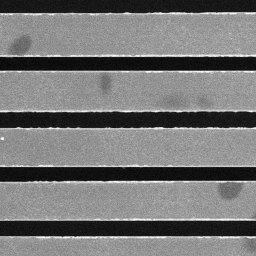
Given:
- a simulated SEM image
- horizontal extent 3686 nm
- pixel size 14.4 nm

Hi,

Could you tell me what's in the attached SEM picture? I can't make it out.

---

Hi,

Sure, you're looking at lines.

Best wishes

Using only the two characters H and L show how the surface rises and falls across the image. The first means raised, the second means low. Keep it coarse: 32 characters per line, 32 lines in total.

LLLLLLLLLLLLLLLLLLLLLLLLLLLLLLLL
LLLLLLLLLLLLLLLLLLLLLLLLLLLLLLLL
HHHHHHHHHHHHHHHHHHHHHHHHHHHHHHHH
HHHHHHHHHHHHHHHHHHHHHHHHHHHHHHHH
HHHHHHHHHHHHHHHHHHHHHHHHHHHHHHHH
HHHHHHHHHHHHHHHHHHHHHHHHHHHHHHHH
HHHHHHHHHHHHHHHHHHHHHHHHHHHHHHHH
LLLLLLLLLLLLLLLLLLLLLLLLLLLLLLLL
LLLLLLLLLLLLLLLLLLLLLLLLLLLLLLLL
HHHHHHHHHHHHHHHHHHHHHHHHHHHHHHHH
HHHHHHHHHHHHHHHHHHHHHHHHHHHHHHHH
HHHHHHHHHHHHHHHHHHHHHHHHHHHHHHHH
HHHHHHHHHHHHHHHHHHHHHHHHHHHHHHHH
HHHHHHHHHHHHHHHHHHHHHHHHHHHHHHHH
LLLLLLLLLLLLLLLLLLLLLLLLLLLLLLLL
LLLLLLLLLLLLLLLLLLLLLLLLLLLLLLLL
HHHHHHHHHHHHHHHHHHHHHHHHHHHHHHHH
HHHHHHHHHHHHHHHHHHHHHHHHHHHHHHHH
HHHHHHHHHHHHHHHHHHHHHHHHHHHHHHHH
HHHHHHHHHHHHHHHHHHHHHHHHHHHHHHHH
HHHHHHHHHHHHHHHHHHHHHHHHHHHHHHHH
LLLLLLLLLLLLLLLLLLLLLLLLLLLLLLLL
LLLLLLLLLLLLLLLLLLLLLLLLLLLLLLLL
HHHHHHHHHHHHHHHHHHHHHHHHHHHHHHHH
HHHHHHHHHHHHHHHHHHHHHHHHHHHHHHHH
HHHHHHHHHHHHHHHHHHHHHHHHHHHHHHHH
HHHHHHHHHHHHHHHHHHHHHHHHHHHHHHHH
LLLLLLLLLLLLLLLLLLLLLLLLLLLLLLLL
LLLLLLLLLLLLLLLLLLLLLLLLLLLLLLLL
LLLLLLLLLLLLLLLLLLLLLLLLLLLLLLLL
HHHHHHHHHHHHHHHHHHHHHHHHHHHHHHHH
HHHHHHHHHHHHHHHHHHHHHHHHHHHHHHHH